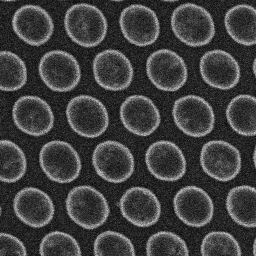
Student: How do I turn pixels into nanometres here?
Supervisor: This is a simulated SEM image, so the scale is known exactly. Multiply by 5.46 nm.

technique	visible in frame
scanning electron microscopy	a regular array of raised bodies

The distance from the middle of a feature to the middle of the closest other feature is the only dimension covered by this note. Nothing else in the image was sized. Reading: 0.285 µm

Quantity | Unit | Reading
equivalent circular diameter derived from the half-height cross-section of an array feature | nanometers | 212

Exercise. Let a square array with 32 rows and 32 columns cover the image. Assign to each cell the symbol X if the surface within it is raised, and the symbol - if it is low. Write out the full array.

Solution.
--------------------------------
--XXXX---XXX----XXX---XXXX---XXX
--XXXX--XXXXX--XXXXX--XXXX--XXXX
--XXXX--XXXXX--XXXXX--XXXXX-XXXX
---XXX---XXXX---XXXX--XXXX---XXX
----------XX-----XX-----X-------
-------X-----XX-----X------X----
XX---XXXX---XXXX---XXXX--XXXX---
XXX--XXXXX--XXXX---XXXX--XXXXX--
XXX--XXXXX--XXXX---XXXX--XXXXX--
XXX---XXX----XXX---XXXX---XXX---
--------------------------------
--XXX----XXX----XXX----XX----XXX
--XXXX---XXXX--XXXX---XXXX---XXX
--XXXX--XXXXX--XXXXX--XXXXX-XXXX
--XXXX---XXXX---XXXX--XXXXX--XXX
---XXX----XXX----XX----XXX----XX
--------------------------------
XX---XXXX---XXXX---XXX---XXXX---
XXX--XXXXX--XXXX--XXXXX--XXXXX--
XXX--XXXXX--XXXXX-XXXXX--XXXXX--
XXX---XXXX--XXXX---XXXX---XXXX--
XX-----XX-----X-----------------
----------X------------X------X-
--XXXX---XXXX---XXX---XXXX---XXX
--XXXX--XXXXX--XXXXX--XXXX---XXX
--XXXXX--XXXX--XXXXX--XXXX---XXX
---XXX---XXXX---XXX----XXX---XXX
--------------------------------
X-----XXX----XX----XXX----XXX---
XXX--XXXXX--XXXX---XXXX--XXXXX--
XXX--XXXXX--XXXXX--XXXX--XXXXX--